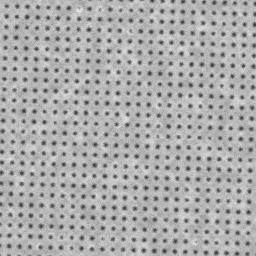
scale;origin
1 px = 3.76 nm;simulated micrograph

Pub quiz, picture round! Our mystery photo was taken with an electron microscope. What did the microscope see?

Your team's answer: a regular array of holes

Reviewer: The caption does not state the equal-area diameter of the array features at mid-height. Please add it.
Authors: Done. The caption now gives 4.23 px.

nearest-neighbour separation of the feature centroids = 38.3 nm